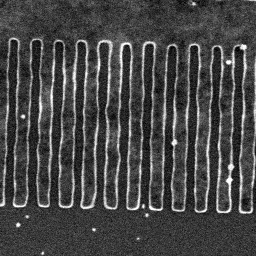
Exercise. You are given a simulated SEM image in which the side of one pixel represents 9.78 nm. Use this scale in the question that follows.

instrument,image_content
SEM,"groups of lines, slits or small figures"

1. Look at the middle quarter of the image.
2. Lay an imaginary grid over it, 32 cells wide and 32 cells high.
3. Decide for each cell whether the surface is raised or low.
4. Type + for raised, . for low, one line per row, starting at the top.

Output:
+++...+++..+++...+++..++++..+++.
+++...+++..+++...+++..++++..+++.
+++...++...+++...+++..++++..+++.
++...+++...+++...+++..+++...+++.
+++..+++...+++...+++..+++...+++.
+++..+++...+++...+++..+++...+++.
+++..+++...+++...+++..+++...+++.
+++..+++...+++...+++..+++...+++.
+++..+++...+++...+++..+++...+++.
+++..+++...+++...+++..+++...+++.
+++..++++..+++...+++..+++...+++.
+++..++++..+++...+++..+++...+++.
+++..++++..+++...+++..+++...+++.
+++..+++...+++...+++..+++...+++.
+++..+++...+++...++...+++...+++.
+++..+++...+++...++...+++..++++.
+++..+++...+++...+++..+++..++++.
++...+++...+++...+++..+++..++++.
++...+++...+++...+++..+++..++++.
++...+++...+++..++++..+++..++++.
++...+++...+++..+++...+++..++++.
++...+++...+++..+++...+++..++++.
++...+++...+++..+++...+++..++++.
++...+++...+++..+++...+++..+++..
++...+++...+++..+++...+++..+++..
++...+++...+++..+++...+++..+++..
++...+++...++...+++...+++..+++..
++...+++..+++...+++...+++..+++..
++...+++..+++...+++...+++..+++..
++...+++..+++...+++...+++..+++..
++...+++..+++...+++..++++..+++..
++...+++..+++...+++..++++..+++..